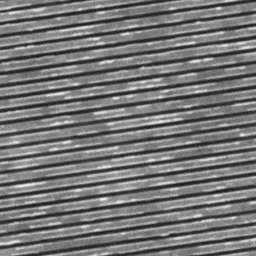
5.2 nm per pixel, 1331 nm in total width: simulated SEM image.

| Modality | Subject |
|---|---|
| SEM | parallel lines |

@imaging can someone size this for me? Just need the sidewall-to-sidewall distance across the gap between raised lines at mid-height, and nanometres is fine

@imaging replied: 23.2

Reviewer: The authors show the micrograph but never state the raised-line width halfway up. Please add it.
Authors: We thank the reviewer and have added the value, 7.94 px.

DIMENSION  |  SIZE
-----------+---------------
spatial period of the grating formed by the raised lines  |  64.1 nm